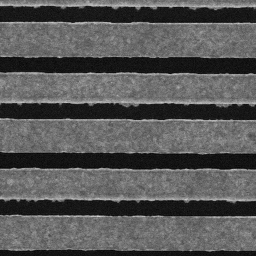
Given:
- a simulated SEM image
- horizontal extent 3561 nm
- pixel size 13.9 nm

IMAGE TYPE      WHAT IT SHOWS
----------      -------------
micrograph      lines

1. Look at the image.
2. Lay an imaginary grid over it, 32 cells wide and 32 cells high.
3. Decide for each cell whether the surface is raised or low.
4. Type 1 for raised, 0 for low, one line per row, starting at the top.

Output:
11111111111111111111111111111111
00000000000000000000000000000000
00000000000000000000000000000000
11111111111111111111111111111111
11111111111111111111111111111111
11111111111111111111111111111111
11111111111111111111111111111111
00000000000000000000000000000000
00000000000000000000000000000000
11111111111111111111111111111111
11111111111111111111111111111111
11111111111111111111111111111111
11111111111111111111111111111111
00000000000000000000000000000000
00000000000000000000000000000000
11111111111111111111111111111111
11111111111111111111111111111111
11111111111111111111111111111111
11111111111111111111111111111111
00000000000000000000000000000000
00000000000000000000000000000000
11111111111111111111111111111111
11111111111111111111111111111111
11111111111111111111111111111111
11111111111111111111111111111111
00000000000000000000000000000000
00000000000000000000000000000000
11111111111111111111111111111111
11111111111111111111111111111111
11111111111111111111111111111111
11111111111111111111111111111111
00000000000000000000000000000000